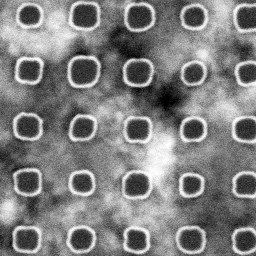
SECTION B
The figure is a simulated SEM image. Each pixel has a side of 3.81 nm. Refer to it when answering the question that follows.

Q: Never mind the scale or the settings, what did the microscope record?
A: a regular array of raised bodies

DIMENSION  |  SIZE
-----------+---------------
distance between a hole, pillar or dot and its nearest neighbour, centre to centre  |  208 nanometers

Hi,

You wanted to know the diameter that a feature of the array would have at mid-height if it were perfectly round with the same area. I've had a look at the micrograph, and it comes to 104 nanometres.